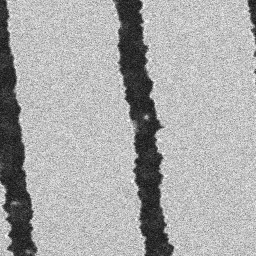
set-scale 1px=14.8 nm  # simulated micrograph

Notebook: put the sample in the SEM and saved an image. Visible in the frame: one or a few lines or trenches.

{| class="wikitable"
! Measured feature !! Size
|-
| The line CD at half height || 28.1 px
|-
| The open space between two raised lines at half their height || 1.55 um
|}